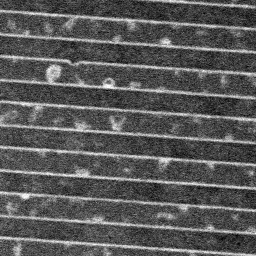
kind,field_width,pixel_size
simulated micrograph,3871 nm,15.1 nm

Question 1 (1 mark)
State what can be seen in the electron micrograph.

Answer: parallel lines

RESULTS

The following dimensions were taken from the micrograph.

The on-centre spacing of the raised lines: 684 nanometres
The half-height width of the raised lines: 372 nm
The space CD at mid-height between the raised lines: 319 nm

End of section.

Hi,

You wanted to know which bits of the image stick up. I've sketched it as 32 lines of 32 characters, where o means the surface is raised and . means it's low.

..........................oooooo
oo..............................
oooooooooooooooo................
oooooooooooooooooooooooooooooo..
...ooooooooooooooooooooooooooooo
.................ooooooooooooooo
................................
ooooooo.........................
oooooooooooooooooooo............
oooooooooooooooooooooooooooooooo
.......ooooooooooooooooooooooooo
.....................ooooooooooo
................................
oooooooooooo....................
oooooooooooooooooooooooooo......
oooooooooooooooooooooooooooooooo
.............ooooooooooooooooooo
.........................ooooooo
o...............................
oooooooooooooooo................
oooooooooooooooooooooooooooooo..
...ooooooooooooooooooooooooooooo
.................ooooooooooooooo
...............................o
ooooooo.........................
ooooooooooooooooooooo...........
oooooooooooooooooooooooooooooooo
.......ooooooooooooooooooooooooo
.....................ooooooooooo
................................
ooooooooooo.....................
ooooooooooooooooooooooooo.......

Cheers